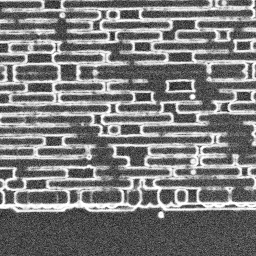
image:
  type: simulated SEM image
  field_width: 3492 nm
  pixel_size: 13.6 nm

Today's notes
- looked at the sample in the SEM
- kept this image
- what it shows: wiring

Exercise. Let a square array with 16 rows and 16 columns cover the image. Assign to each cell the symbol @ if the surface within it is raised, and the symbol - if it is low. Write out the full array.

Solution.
@@@@@@@@@@@@@@@@
@@@@@@@@@@@@@@@@
@@@@@@@@@@@@@@@@
@@@@@@@@@@@@@@@@
@@@@@@@@@@@@@@@@
@@@@@@@@@@@@@@@@
@@@@@@@@@@@@@@@@
@@@@@@@@@@@@@@@@
@@@@@@@@@@@@@@@@
@@@@@@@@@@@@@@@@
@@@@@@@@@@@@@@@@
@@@@@@@@@@@@@@@@
@@@@@@@@@-@@@@@@
----------------
----------------
----------------